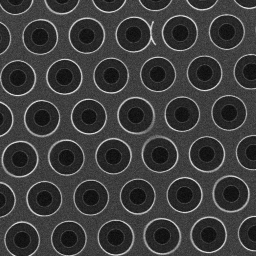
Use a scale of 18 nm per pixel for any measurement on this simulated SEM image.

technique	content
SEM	an array of small figures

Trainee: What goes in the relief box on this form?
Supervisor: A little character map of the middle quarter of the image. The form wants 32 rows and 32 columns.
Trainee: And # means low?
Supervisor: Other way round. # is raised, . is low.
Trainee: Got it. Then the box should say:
...#####.......#####.......####.
....####........###.........###.
....###.........###.........###.
.....###........###.........###.
....####........####.......#####
....####.......#####.......#####
...######.....########...#######
.###############################
#################..#########...#
####....#######......######.....
###.......####........####......
##........####........###.......
##........####........###.......
##.........###........###.......
##........####........####......
###.......####........####......
####.....######......#######...#
######.#########################
######################...#######
..########.....######......#####
....#####.......####........####
....####........####........####
.....###.........###........###.
.....###.........###........###.
.....###........####........####
.....####.......#####......#####
....######.....#######....######
..##########.###################
##############################.#
#####....#######.....######.....
####......#####.......####......
###........###........####......